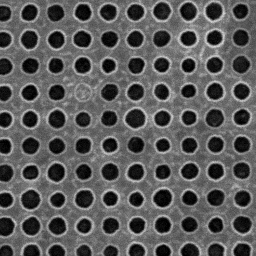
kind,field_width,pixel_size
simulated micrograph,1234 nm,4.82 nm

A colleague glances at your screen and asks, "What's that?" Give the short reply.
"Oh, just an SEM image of a regular array of holes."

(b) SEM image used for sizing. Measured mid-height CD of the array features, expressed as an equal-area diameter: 84.2 nm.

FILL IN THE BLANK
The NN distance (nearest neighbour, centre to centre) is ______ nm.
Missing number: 125